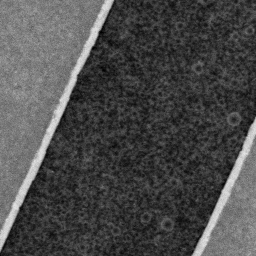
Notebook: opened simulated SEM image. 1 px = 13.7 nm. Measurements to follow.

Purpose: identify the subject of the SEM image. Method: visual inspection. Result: one or a few lines or trenches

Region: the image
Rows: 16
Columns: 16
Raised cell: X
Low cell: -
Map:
XXXXXXX---------
XXXXXX----------
XXXXXX----------
XXXXX-----------
XXXXX-----------
XXXX------------
XXXX------------
XXX-------------
XXX-------------
XXX------------X
XX-------------X
XX------------XX
X-------------XX
X------------XXX
-------------XXX
-------------XXX